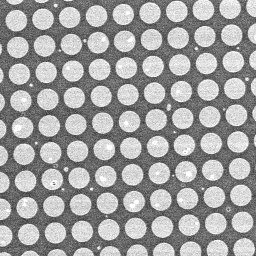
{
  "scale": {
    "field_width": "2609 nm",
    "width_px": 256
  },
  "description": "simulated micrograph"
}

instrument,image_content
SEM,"an array of small figures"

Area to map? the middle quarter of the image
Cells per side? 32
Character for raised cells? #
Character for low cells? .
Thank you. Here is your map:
####..#####..#####..#####.#####.
#####.#####..#####..#####..####.
#####..####...####...###....##..
####...###.....#................
.............................#..
...............##....###...####.
.###...####...####..#####..#####
#####..#####.######.#####..#####
#####..#####..####..#####..####.
#####..####...####...###........
.###.....#......................
.......................#....###.
.........##....###...####..#####
.####..#####..#####..#####.#####
#####..#####..#####..#####.#####
.####..#####..#####..####...###.
.####...####...###..............
..##............................
......................###...####
..##....####...####..#####..####
.#####..####..#####..#####..####
.#####..#####.#####..#####..####
.#####..####...####...###....##.
.####....###....#...............
..............................#.
................##....####..####
..###...####...####..#####..####
.#####..#####..#####.#####..####
.#####..#####..#####..####..####
.#####..#####..####...###.......
..###.....#.....................
.............................###